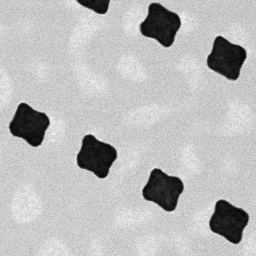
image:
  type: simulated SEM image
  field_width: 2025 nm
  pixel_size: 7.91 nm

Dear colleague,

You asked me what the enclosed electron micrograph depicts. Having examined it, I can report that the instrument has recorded holes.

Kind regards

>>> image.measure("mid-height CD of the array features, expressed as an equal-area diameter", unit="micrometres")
0.305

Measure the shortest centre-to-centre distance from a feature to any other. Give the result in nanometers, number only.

583